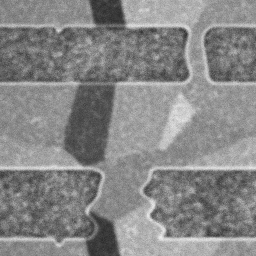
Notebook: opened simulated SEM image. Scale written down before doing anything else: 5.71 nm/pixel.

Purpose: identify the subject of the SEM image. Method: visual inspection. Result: one or a few lines or trenches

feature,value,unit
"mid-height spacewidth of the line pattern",333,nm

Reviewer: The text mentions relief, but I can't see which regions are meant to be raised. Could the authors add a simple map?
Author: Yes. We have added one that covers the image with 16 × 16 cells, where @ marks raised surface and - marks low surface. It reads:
@@@@@@@@@@@@@@@@
@@@@@@@@@@@@@@@@
------------@---
------------@---
------------@---
@@@@@@@@@@@@@@@@
@@@@@@@@@@@@@@@@
@@@@@@@@@@@@@@@@
@@@@@@@@@@@@@@@@
@@@@@@@@@@@@@@@@
@@@@@@@@@@@@@@@@
------@@@-------
------@@@-------
------@@@-------
------@@@@------
@@@@@@@@@@@@@@@@